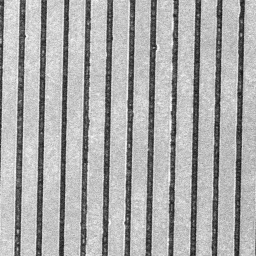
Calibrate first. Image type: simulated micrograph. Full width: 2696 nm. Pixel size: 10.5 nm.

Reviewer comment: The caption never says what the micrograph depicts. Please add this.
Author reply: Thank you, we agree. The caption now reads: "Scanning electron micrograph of parallel lines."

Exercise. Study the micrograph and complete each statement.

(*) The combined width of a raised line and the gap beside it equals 231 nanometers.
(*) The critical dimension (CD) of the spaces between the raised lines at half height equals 63.2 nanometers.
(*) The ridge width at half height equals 163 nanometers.